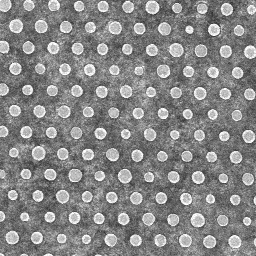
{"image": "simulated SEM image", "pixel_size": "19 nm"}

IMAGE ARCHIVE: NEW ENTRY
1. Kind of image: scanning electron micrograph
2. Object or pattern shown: a regular array of raised bodies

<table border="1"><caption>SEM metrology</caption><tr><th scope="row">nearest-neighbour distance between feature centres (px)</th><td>24.2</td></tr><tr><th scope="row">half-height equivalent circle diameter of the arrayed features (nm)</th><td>214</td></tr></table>